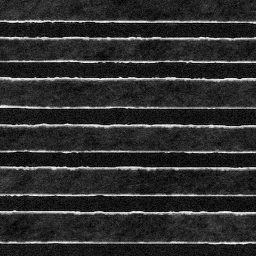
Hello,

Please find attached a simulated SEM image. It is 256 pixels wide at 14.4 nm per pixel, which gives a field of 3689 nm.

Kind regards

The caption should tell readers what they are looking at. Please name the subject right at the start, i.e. lines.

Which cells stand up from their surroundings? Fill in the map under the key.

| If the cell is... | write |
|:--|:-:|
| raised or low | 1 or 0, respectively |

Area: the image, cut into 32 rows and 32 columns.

11111111111111111111111111111111
11111111111111111111111111111111
11111111111111111111111111111111
00000000000000000000000000000000
00000000000000000000000000000000
11111111111111111111111111111111
11111111111111111111111111111111
11111111111111111111111111111111
00000000000000000000000000000000
00000000000000000000000000000000
11111111111111111111111111111111
11111111111111111111111111111111
11111111111111111111111111111111
00000000000000000000000000000000
00000000000000000000000000000000
00000000000000000000000000000000
11111111111111111111111111111111
11111111111111111111111111111111
11111111111111111111111111111111
00000000000000000000000000000000
00000000000000000000000000000000
11111111111111111111111111111111
11111111111111111111111111111111
11111111111111111111111111111111
00000000000000000000000000000000
00000000000000000000000000000000
11111111110010001100011101011000
11111111111111111111111111111111
11111111111111111111111111111111
11111111111111111111111111111111
00000000000000000000000000000000
00000000000000000000000000000000